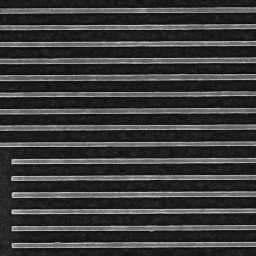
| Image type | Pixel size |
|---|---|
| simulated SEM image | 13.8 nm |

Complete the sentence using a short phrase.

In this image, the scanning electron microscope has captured parallel lines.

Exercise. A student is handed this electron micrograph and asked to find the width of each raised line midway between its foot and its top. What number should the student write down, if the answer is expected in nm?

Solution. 60.3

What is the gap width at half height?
166 nanometres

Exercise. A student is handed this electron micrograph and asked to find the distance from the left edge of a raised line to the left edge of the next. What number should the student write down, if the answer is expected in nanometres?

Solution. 231